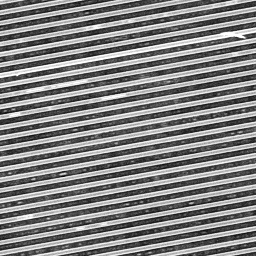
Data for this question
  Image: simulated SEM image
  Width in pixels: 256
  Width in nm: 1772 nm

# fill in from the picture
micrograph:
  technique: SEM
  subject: parallel lines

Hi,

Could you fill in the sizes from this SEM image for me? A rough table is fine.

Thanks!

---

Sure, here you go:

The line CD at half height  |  25.6 nanometres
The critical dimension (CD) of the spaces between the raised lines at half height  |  6.27 pixels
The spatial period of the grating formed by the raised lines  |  0.0712 um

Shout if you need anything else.